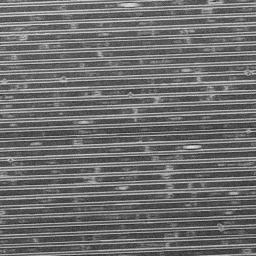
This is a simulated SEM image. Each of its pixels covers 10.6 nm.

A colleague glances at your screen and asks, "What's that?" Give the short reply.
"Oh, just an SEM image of parallel lines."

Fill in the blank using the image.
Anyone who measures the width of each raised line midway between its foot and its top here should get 26.4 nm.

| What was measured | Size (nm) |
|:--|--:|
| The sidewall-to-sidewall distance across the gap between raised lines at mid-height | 76.4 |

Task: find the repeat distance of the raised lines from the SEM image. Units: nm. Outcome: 102